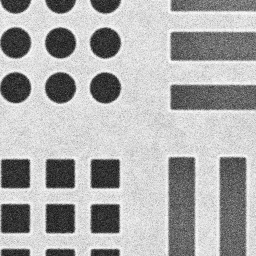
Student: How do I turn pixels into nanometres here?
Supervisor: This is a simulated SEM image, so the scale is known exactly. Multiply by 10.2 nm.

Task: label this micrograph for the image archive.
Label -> groups of lines, slits or small figures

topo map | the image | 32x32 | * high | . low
....**...**....******...........
*..****.****..********..........
********************************
*..****.*****.******************
....**...**....******...........
....**....*....******...........
....**...***...******...........
**********************..........
********************************
*..***...***..******************
....**...**....*******..........
....**....*....******...........
*..***...***..*******...........
*********************...........
********************************
********************************
********************************
********************************
********************************
********************************
....**...**....******....**....*
....**...**....******....**....*
....**...**....******....**....*
...***...***...******....**....*
*********************....**....*
...***...***...******....**....*
....**...**....******....**....*
....**...**....******....**....*
....**...**....******....**....*
*********************....**....*
*********************....**....*
....**...**....******....**....*